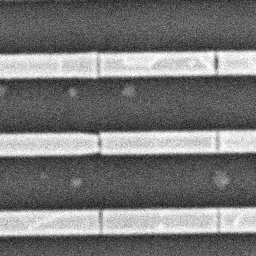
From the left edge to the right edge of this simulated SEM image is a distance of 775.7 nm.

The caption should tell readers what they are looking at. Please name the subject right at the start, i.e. wiring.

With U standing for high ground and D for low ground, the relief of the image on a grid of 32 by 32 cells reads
DDDDDDDDDDDDDDDDDDDDDDDDDDDDDDDD
DDDDDDDDDDDDDDDDDDDDDDDDDDDDDDDD
DDDDDDDDDDDDDDDDDDDDDDDDDDDDDDDD
DDDDDDDDDDDDDDDDDDDDDDDDDDDDDDDD
DDDDDDDDDDDDDDDDDDDDDDDDDDDDDDDD
DDDDDDDDDDDDDDDDDDDDDDDDDDDDDDDD
DDDDDDDDDDDDDDDDDDDDDDDDDDDDDDDD
UUUUUUUUUUUUUUUUUUUUUUUUUUUUUUUU
UUUUUUUUUUUUUUUUUUUUUUUUUUUUUUUU
UUUUUUUUUUUUDDDDDDDDDDDDDDDDDDDD
DDDDDDDDDDDDDDDDDDDDDDDDDDDDDDDD
DDDDDDDDDDDDDDDDDDDDDDDDDDDDDDDD
DDDDDDDDDDDDDDDDDDDDDDDDDDDDDDDD
DDDDDDDDDDDDDDDDDDDDDDDDDDDDDDDD
DDDDDDDDDDDDDDDDDDDDDDDDDDDDDDDD
DDDDDDDDDDDDDDDDDDDDDDDDDDDDDDDD
DDDDDDDDDDDDDDDDDDDDDDDDDDUUUUUU
UUUUUUUUUUUUUUUUUUUUUUUUUUUUUUUU
UUUUUUUUUUUUUUUUUUUUUUUUUUUUUUUU
DDDDDDDDDDDDDDDDDDDDDDDDDDDDDDDD
DDDDDDDDDDDDDDDDDDDDDDDDDDDDDDDD
DDDDDDDDDDDDDDDDDDDDDDDDDDDDDDDD
DDDDDDDDDDDDDDDDDDDDDDDDDDDDDDDD
DDDDDDDDDDDDDDDDDDDDDDDDDDDDDDDD
DDDDDDDDDDDDDDDDDDDDDDDDDDDDDDDD
DDDDDDDDDDDDDDDDDDDDDDDDDDDDDDDD
DDUUUUUUUUUUUUUUUUUUUUUUUUUUUUUU
UUUUUUUUUUUUUUUUUUUUUUUUUUUUUUUU
UUUUUUUUUUUUUUUUUUUUUUUUUUUUUUUU
DDDDDDDDDDDDDDDDDDDDDDDDDDDDDDDD
DDDDDDDDDDDDDDDDDDDDDDDDDDDDDDDD
DDDDDDDDDDDDDDDDDDDDDDDDDDDDDDDD